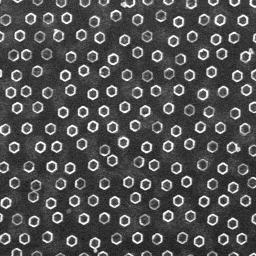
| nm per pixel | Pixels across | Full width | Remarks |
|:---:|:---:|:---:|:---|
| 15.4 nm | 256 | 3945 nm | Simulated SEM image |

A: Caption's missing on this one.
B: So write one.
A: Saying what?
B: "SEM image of a regular array of raised bodies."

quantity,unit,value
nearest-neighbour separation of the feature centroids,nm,281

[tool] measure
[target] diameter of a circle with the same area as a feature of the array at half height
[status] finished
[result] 160 nanometres